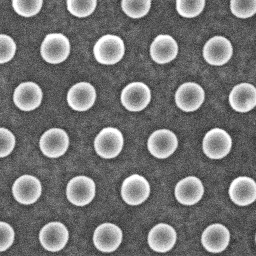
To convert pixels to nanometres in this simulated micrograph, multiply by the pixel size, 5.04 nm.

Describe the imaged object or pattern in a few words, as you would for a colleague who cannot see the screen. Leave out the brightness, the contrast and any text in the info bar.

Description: a regular array of raised bodies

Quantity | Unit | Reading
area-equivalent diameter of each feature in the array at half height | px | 28.6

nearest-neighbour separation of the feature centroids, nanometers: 270